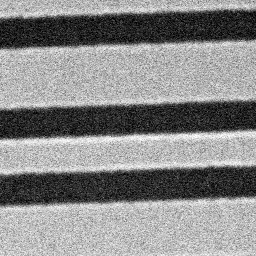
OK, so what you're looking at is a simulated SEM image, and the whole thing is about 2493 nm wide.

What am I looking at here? lines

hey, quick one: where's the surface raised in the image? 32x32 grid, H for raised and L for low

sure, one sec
HHHHHHHHHHHHHHHHHHHHHHHHHHHHHHHH
HHHHHHHHHHHHHHHLLHLLLLLLLLLLLLLL
LLLLLLLLLLLLLLLLLLLLLLLLLLLLLLLL
LLLLLLLLLLLLLLLLLLLLLLLLLLLLLLLL
LLLLLLLLLLLLLLLLLLLLLLLLLLLLLLLL
LLLLLLLLLLLLLLLLLLLLLLLHHHHHHHHH
HHHHHHHHHHHHHHHHHHHHHHHHHHHHHHHH
HHHHHHHHHHHHHHHHHHHHHHHHHHHHHHHH
HHHHHHHHHHHHHHHHHHHHHHHHHHHHHHHH
HHHHHHHHHHHHHHHHHHHHHHHHHHHHHHHH
HHHHHHHHHHHHHHHHHHHHHHHHHHHHHHHH
HHHHHHHHHHHHHHHHHHHHHHHHHHHHHHHH
HHHHHHHHHHHHHHHHHHHHHHHHHHLLLLLL
LLLLLLLLLLLLLLLLLLLLLLLLLLLLLLLL
LLLLLLLLLLLLLLLLLLLLLLLLLLLLLLLL
LLLLLLLLLLLLLLLLLLLLLLLLLLLLLLLL
LLLLLLLLLLLLLLLLLLLLLLLLLLLLLLHH
LLLHHHHHHHHHHHHHHHHHHHHHHHHHHHHH
HHHHHHHHHHHHHHHHHHHHHHHHHHHHHHHH
HHHHHHHHHHHHHHHHHHHHHHHHHHHHHHHH
HHHHHHHHHHHHHHHHHHHHHHHHHHHHHHHH
HHHLHLLLLLLLLLLLLLLLLLLLLLLLLLLL
LLLLLLLLLLLLLLLLLLLLLLLLLLLLLLLL
LLLLLLLLLLLLLLLLLLLLLLLLLLLLLLLL
LLLLLLLLLLLLLLLLLLLLLLLLLLLLLLLL
LLLLLLLLLLLLLLHHHHHHHHHHHHHHHHHH
HHHHHHHHHHHHHHHHHHHHHHHHHHHHHHHH
HHHHHHHHHHHHHHHHHHHHHHHHHHHHHHHH
HHHHHHHHHHHHHHHHHHHHHHHHHHHHHHHH
HHHHHHHHHHHHHHHHHHHHHHHHHHHHHHHH
HHHHHHHHHHHHHHHHHHHHHHHHHHHHHHHH
HHHHHHHHHHHHHHHHHHHHHHHHHHHHHHHH